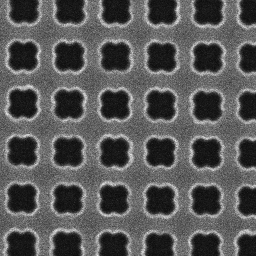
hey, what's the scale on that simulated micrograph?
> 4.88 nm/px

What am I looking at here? a regular array of holes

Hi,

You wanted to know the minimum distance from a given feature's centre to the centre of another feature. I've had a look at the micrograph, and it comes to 224 nm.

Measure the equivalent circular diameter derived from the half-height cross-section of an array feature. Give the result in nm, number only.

138